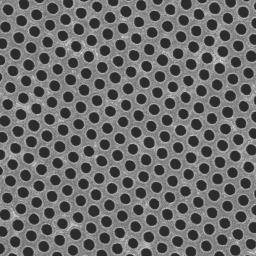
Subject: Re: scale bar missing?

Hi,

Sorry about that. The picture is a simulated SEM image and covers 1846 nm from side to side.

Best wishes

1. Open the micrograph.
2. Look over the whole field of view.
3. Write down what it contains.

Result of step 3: a regular array of holes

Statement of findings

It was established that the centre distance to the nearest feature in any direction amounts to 118 nm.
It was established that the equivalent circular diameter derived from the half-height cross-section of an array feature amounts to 0.0763 µm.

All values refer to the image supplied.